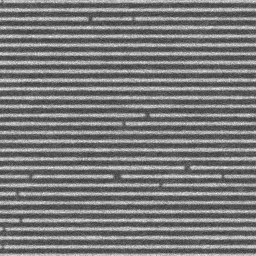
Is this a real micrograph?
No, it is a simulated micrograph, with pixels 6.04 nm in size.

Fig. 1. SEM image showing parallel lines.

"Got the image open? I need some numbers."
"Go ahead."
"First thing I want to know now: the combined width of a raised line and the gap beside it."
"53 nm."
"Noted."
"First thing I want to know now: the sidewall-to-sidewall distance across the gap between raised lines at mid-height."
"36.2 nanometers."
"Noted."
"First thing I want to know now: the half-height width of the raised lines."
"15.8 nanometres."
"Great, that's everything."